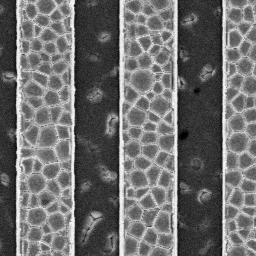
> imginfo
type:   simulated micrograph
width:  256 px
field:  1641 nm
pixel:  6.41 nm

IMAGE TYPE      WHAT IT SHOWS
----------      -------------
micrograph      one or a few lines or trenches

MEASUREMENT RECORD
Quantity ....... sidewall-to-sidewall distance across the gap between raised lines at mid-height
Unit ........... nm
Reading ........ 306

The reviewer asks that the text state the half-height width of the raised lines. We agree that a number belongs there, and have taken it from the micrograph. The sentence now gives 353 nm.